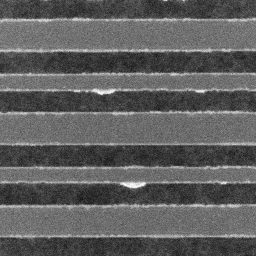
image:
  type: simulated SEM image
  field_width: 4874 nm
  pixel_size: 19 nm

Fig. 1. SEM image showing lines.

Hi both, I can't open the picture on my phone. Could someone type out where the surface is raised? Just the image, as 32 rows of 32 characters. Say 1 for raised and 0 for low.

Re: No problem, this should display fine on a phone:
00000000000000000000000000000000
00000000000000000000000000000000
01001111111111111111111111111111
11111111111111111111111111111111
11111111111111111111111111111111
11111111111111111111111111111111
00000000000000000000000000000000
00000000000000000000000000000000
00000000000000000000000000000000
11111111111111111111111111111111
11111111111111111111111111111111
00000000000000000000000000000000
00000000000000000000000000000000
00000000000000000000000000000000
11111111111111111111111111111111
11111111111111111111111111111111
11111111111111111111111111111111
11111111111111111111111111111111
00000000000000000000000000000000
00000000000000000000000000000000
00000000000000000000000000000000
11111111111111111111111111111111
11111111111111111111111111111111
00000000000000000000000000000000
00000000000000000000000000000000
00000000000000000000000000000000
11111111111111111111111111111111
11111111111111111111111111111111
11111111111111111111111111111111
11101111111111111110001111111111
00000000000000000000000000000000
00000000000000000000000000000000